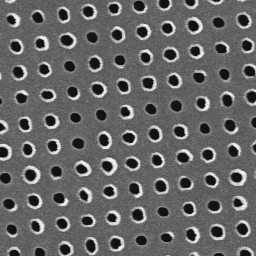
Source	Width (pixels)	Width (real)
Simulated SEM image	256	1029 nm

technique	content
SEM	a regular array of holes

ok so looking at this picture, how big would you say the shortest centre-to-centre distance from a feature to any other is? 0.102 micrometres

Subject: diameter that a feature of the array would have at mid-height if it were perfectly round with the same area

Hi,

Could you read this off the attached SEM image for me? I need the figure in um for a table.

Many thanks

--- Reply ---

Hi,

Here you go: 0.0411